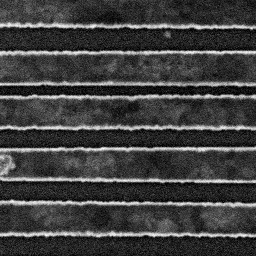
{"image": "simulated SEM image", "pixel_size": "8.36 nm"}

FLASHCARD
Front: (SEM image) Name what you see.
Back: lines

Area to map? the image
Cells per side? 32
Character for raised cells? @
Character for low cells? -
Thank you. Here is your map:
@@@@@@@@@@@@@@@@@@@@@@@@@@@@@@@@
@@@@@@@@@@@@@@@@@@@@@@@@@@@@@@@@
@@@@@@@@@@@@@@@@@@@@@@@@@@@@@@@@
--------------------------------
--------------------------------
--------------------------------
--------------------@@------@---
@@@@@@@@@@@@@@@@@@@@@@@@@@@@@@@@
@@@@@@@@@@@@@@@@@@@@@@@@@@@@@@@@
@@@@@@@@@@@@@@@@@@@@@@@@@@@@@@@@
--------------------------------
--------------------------------
@@@@@@@@@@@@@@@@@@@@@@@@@@@@@@@@
@@@@@@@@@@@@@@@@@@@@@@@@@@@@@@@@
@@@@@@@@@@@@@@@@@@@@@@@@@@@@@@@@
@@@@@@@@@@@@@@@@@@@@@@@@@@@@@@@@
--------------------------------
--------------------------------
--------------------------------
@@@@@@@@@@@@@@@@@@@@@@@@@@@@@@@@
@@@@@@@@@@@@@@@@@@@@@@@@@@@@@@@@
@@@@@@@@@@@@@@@@@@@@@@@@@@@@@@@@
-------------@@@@@@@@@@@@@@@@@@@
--------------------------------
--------------------------------
@@@@@@@@@@@@@@@@@@@@@@@@--------
@@@@@@@@@@@@@@@@@@@@@@@@@@@@@@@@
@@@@@@@@@@@@@@@@@@@@@@@@@@@@@@@@
@@@@@@@@@@@@@@@@@@@@@@@@@@@@@@@@
--------------------------------
--------------------------------
--------------------------------